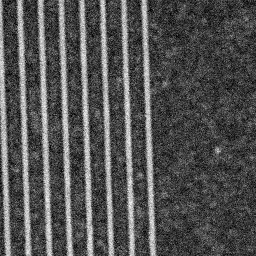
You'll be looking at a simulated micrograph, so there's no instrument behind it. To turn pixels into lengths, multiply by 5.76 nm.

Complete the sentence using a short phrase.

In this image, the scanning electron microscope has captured parallel lines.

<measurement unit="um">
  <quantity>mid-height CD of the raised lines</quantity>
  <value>0.0259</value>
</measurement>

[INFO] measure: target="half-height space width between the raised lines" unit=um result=0.0943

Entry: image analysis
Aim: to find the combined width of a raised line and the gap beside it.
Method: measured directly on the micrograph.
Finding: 119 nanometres